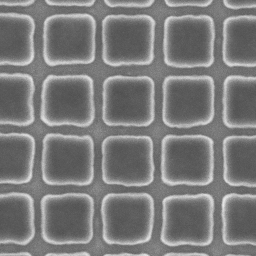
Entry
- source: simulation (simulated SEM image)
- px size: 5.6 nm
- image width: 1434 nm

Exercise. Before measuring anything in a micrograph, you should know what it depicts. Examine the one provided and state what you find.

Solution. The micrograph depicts a regular array of raised bodies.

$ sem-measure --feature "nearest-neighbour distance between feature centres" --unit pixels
58.6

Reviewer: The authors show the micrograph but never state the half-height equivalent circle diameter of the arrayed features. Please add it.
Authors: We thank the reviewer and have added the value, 54.4 px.